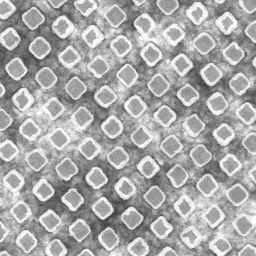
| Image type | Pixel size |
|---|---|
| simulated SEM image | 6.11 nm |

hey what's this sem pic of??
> a regular array of raised bodies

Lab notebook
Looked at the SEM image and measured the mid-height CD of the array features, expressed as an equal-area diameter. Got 118 nm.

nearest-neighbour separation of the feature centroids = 186 nm